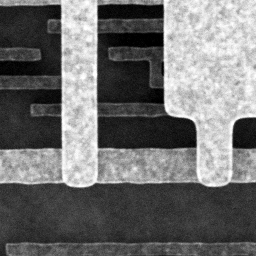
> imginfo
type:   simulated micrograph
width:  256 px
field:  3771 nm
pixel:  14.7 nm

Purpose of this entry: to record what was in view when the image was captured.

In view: wiring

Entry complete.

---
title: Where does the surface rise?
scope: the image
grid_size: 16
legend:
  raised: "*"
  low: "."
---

....**....******
....**....******
....**....******
....**....******
....**....******
....**....******
....**....******
....**......***.
....**......***.
....**......**..
....**......**..
....**.......*..
................
................
................
................